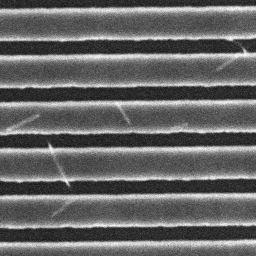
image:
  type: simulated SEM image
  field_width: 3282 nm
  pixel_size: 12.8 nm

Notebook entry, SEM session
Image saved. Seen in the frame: lines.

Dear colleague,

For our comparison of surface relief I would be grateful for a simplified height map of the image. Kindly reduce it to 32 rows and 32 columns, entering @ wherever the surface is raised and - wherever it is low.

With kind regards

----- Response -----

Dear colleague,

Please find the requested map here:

--------------------------------
@@@@@@@@@@@@@@@@@@@@@@@@@@@@@@@@
@@@@@@@@@@@@@@@@@@@@@@@@@@@@@@@@
@@@@@@@@@@@@@@@@@@@@@@@@@@@@@@@@
@@@@@@@@@@@@@@@@@@@@@@@@@@@@@@@@
--------------------------------
--------------------------------
@@@@@@@@@@@@@@@@@@@@@@@@@@@@@@@@
@@@@@@@@@@@@@@@@@@@@@@@@@@@@@@@@
@@@@@@@@@@@@@@@@@@@@@@@@@@@@@@@@
@@@@@@@@@@@@@@@@@@@@@@@@@@@@@@@@
--------------------------------
--------------------------------
@@@@@@@@@@@@@@@@@@@@@@@@@@@@@@@@
@@@@@@@@@@@@@@@@@@@@@@@@@@@@@@@@
@@@@@@@@@@@@@@@@@@@@@@@@@@@@@@@@
@@@@@@@@@@@@@@@@@@@@@@---@------
--------------------------------
-----------------------------@@@
@@@@@@@@@@@@@@@@@@@@@@@@@@@@@@@@
@@@@@@@@@@@@@@@@@@@@@@@@@@@@@@@@
@@@@@@@@@@@@@@@@@@@@@@@@@@@@@@@@
@@@@@@@@@@@@@@@@@@@--@-@--------
--------------------------------
----------------@@@@@@@@@@@@@@@@
@@@@@@@@@@@@@@@@@@@@@@@@@@@@@@@@
@@@@@@@@@@@@@@@@@@@@@@@@@@@@@@@@
@@@@@@@@@@@@@@@@@@@@@@@@@@@@@@@@
-@@-@---------------------------
--------------------------------
@@@@@@@@@@@@@@@@@@@@@@@@@@@@@@@@
@@@@@@@@@@@@@@@@@@@@@@@@@@@@@@@@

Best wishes